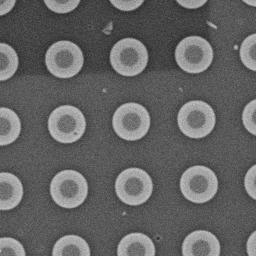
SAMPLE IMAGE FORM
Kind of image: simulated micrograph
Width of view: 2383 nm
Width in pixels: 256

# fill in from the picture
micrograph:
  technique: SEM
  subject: an array of small figures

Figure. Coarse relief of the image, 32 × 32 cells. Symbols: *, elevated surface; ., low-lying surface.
**....****....****....***......*
*......**.......................
................................
................................
...............................*
*......**.....****....****....**
**....****....****....*****...**
**....****....****....****....**
**....****....****.....***.....*
*......**.......................
................................
................................
................................
.......**......***.....***.....*
**....****....*****...*****...**
***...*****...*****...*****...**
**....****.....***.....***.....*
**.....***......*...............
................................
................................
................................
........**.....***.....****....*
**.....****....****....****....*
***...*****...*****....****....*
***...*****....****....****....*
**.....***......**..............
................................
................................
................................
........**......**......***....*
***....****....****....****....*
***....****....****....****....*